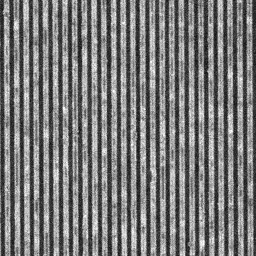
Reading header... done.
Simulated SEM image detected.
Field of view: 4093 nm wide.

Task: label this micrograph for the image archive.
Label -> parallel lines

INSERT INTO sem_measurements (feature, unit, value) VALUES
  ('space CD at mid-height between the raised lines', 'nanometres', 102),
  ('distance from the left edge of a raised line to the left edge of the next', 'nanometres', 155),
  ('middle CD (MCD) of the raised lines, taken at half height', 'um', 0.058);